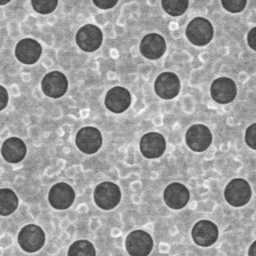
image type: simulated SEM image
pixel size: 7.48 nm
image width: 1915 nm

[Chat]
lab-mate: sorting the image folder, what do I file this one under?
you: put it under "a regular array of holes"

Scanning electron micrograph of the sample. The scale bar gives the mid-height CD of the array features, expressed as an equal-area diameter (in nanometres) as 210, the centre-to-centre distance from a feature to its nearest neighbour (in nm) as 351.